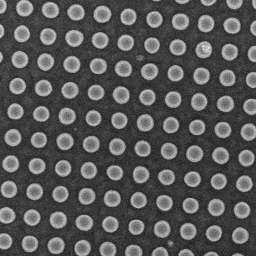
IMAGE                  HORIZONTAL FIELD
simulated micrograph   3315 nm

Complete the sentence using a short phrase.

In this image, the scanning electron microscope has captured an array of small figures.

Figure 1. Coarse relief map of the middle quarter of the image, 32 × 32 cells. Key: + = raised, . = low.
++++...++++..++++...+++....++...
.+++...+++...++++..++++...++++..
.............++++..++++...++++..
....................+++...++++..
................................
+++....++.......................
++++..++++...+++....++..........
+++...++++..++++...++++...+++...
.+.....++...++++...++++..++++...
.............+++...+++...++++...
..........................+++...
++..............................
+++...+++....++.................
+++...+++...++++...+++....++....
++....+++...++++..++++...++++...
............+++...++++...++++..+
...................+++...+++...+
+...............................
++....++........................
++...++++...+++....++...........
++...++++..++++...+++....+++....
.....+++...++++...++++..++++...+
............++....+++...++++...+
.........................++....+
+...............................
++...+++....+...................
++..++++...++++...+++...........
+...++++...++++..++++...+++....+
.....++.....++...++++...++++..++
..................++....+++...++
...............................+
+...+++.........................